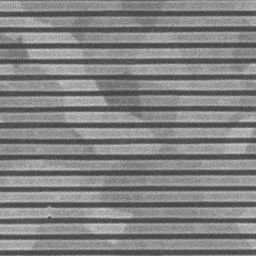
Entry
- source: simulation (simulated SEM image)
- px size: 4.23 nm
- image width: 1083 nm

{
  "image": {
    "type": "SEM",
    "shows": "parallel lines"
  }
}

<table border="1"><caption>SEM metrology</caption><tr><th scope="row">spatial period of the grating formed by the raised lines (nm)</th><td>67.3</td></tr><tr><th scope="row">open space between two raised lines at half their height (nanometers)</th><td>27.5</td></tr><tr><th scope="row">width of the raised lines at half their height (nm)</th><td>38.6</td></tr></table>